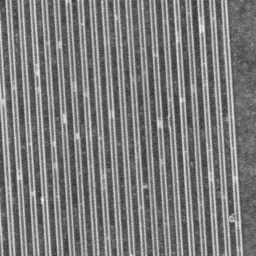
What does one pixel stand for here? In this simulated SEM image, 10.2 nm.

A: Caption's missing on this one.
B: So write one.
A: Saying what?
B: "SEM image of parallel lines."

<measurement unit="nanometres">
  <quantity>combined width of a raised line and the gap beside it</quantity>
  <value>122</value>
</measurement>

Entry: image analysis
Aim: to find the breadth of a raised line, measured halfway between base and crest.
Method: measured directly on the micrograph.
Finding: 44.8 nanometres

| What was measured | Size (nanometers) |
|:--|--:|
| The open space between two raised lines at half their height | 78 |